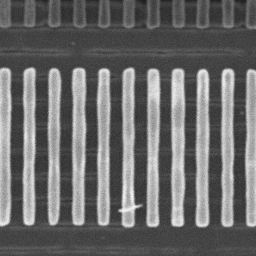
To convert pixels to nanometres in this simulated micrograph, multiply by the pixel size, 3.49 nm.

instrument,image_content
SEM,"wiring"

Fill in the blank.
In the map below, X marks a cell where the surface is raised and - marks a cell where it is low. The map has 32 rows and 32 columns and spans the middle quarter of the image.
--------------------------------
---XX----XX----XXX---XX-----X---
--XXX----XX----XXX---XXX---XXX--
--XXX----XX----XXX---XXX---XXX--
--XXX----XX----XX----XXX---XXX--
--XXX----XX----XX----XXX---XXX--
--XXX----XX----XX----XXX---XXX--
--XXX----XX----XX----XXX---XXX--
--XXX----XX----XX----XXX---XXX--
--XXX----XX----XX----XXX---XXX--
--XXX----XX----XX----XXX---XXX--
--XXX----XX----XX----XXX---XXX--
--XXX----XX----XX----XXX---XXX--
--XXX----XX----XX----XXX---XXX--
--XXX----XX----XX----XXX---XXX--
--XXX----XX----XX----XXX---XXX--
--XXX----XX----XXX---XXX---XXX--
--XXX----XX----XXX---XXX---XXX--
--XXX----XX----XXX---XXX---XXX--
--XXX----XX----XX----XXX---XXX--
--XXX----XX----XX----XXX---XXX--
--XXX----XX----XX----XXX---XXX--
--XXX----XX----XX----XX----XXX--
--XXX----XX----XX----XX----XXX--
--XXX----XX----XX----XX----XXX--
--XXX----XX----XX----XX----XXX--
--XXX----XX----XX----XX----XXX--
--XXX----XX----XX----XXX---XXX--
--XXX----XX----XX----XXX---XXX--
--XXX----XX----XX----XXX---XXX--
--XXX----XX----XX----XXX---XXX--
--XXX----XX----XX----XXX---XXX--